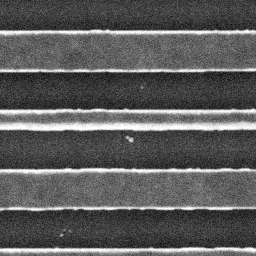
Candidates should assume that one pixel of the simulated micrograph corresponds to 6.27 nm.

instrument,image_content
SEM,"lines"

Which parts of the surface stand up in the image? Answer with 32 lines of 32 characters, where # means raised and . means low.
................................
................................
................................
................................
################################
################################
################################
################################
################################
................................
................................
................................
................................
................................
################################
################################
................................
................................
................................
................................
................................
################################
################################
################################
################################
################################
................................
................................
................................
................................
................................
################################